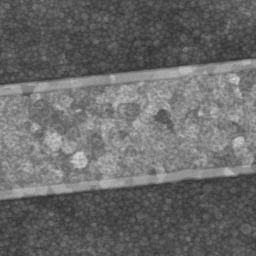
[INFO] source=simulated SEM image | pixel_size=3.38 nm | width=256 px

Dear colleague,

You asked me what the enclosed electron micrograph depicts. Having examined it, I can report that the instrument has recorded one or a few lines or trenches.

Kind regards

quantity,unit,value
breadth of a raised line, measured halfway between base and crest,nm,348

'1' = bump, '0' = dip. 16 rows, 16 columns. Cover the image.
0000000000000000
0000000000000000
0000000000000000
0000000000000000
0000000000011111
0011111111111111
1111111111111111
1111111111111111
1111111111111111
1111111111111111
1111111111111111
1111110000000000
0000000000000000
0000000000000000
0000000000000000
0000000000000000